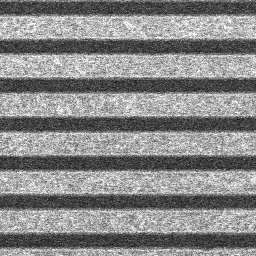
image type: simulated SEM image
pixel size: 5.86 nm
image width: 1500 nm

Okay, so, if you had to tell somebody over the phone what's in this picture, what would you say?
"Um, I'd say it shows parallel lines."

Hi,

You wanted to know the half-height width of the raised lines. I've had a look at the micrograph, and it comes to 23.6 px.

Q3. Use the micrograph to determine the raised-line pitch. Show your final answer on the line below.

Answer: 227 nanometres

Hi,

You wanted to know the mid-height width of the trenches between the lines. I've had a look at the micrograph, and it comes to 90.8 nm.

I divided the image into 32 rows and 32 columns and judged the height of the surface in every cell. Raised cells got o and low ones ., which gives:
................................
................................
oooooooooooooooooooooooooooooooo
oooooooooooooooooooooooooooooooo
oooooooooooooooooooooooooooooooo
................................
................................
oooooooooooooooooooooooooooooooo
oooooooooooooooooooooooooooooooo
oooooooooooooooooooooooooooooooo
................................
................................
oooooooooooooooooooooooooooooooo
oooooooooooooooooooooooooooooooo
oo.o......o....oo.o.oooo.o...oo.
................................
................................
oooooooooooooooooooooooooooooooo
oooooooooooooooooooooooooooooooo
................................
................................
oooooooooooooooooooooooooooooooo
oooooooooooooooooooooooooooooooo
oooooooooooooooooooooooooooooooo
................................
................................
oooooooooooooooooooooooooooooooo
oooooooooooooooooooooooooooooooo
oooooooooooooooooooooooooooooooo
................................
................................
oooooooooooooooooooooooooooooooo